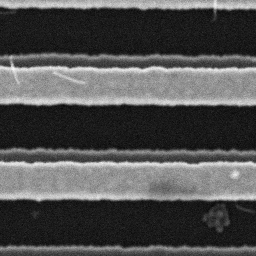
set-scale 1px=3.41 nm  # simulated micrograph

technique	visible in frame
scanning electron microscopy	lines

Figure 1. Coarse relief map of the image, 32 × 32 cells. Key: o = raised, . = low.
oooooooooooooooooooooooooooooooo
................................
................................
................................
................................
................................
................................
oooooooooooooooooooooooooooooooo
oooooooooooooooooooooooooooooooo
oooooooooooooooooooooooooooooooo
oooooooooooooooooooooooooooooooo
oooooooooooooooooooooooooooooooo
oooooooooooooooooooooooooooooooo
................................
................................
................................
................................
................................
................................
oooooooooooooooooooooooooooooooo
oooooooooooooooooooooooooooooooo
oooooooooooooooooooooooooooooooo
oooooooooooooooooooooooooooooooo
oooooooooooooooooooooooooooooooo
oooooooooooooooooooooooooooooooo
................................
................................
................................
................................
................................
................................
oooooooooooooooooooooooooooooooo